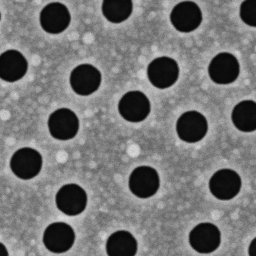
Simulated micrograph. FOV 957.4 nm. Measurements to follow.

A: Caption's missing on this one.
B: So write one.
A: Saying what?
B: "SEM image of a regular array of holes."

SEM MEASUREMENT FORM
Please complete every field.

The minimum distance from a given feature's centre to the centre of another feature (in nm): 208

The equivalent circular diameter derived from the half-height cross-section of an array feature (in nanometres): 118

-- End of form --